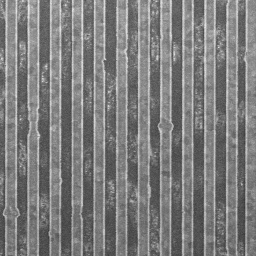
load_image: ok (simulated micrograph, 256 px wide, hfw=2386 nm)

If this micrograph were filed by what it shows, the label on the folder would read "parallel lines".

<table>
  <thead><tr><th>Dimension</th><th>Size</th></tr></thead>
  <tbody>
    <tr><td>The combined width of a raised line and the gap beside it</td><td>0.205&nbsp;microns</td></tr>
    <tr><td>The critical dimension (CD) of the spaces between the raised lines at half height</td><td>0.115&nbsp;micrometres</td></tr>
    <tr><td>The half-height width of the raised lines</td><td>88.5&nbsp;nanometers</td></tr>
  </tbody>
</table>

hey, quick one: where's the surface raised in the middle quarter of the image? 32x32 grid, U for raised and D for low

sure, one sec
DDUUDDDDUUDDDUUUDDDUUDDDUUUDDDUU
DDUUDDDDUUDDDUUUDDDUUDDDUUUDDDUU
DDUUDDDDUUDDDUUUDDDUUDDDUUUDDDUU
DDUUDDDDUUDDDUUUDDDUUDDDUUUDDDUU
DDUUDDDDUUDDDUUUDDDUUDDDUUUDDDUU
DDUUDDDDUUDDDUUUDDDUUDDDUUUDDDUU
DDUUDDDDUUDDDUUUDDDUUDDDUUUDDDUU
DDUUDDDDUUDDDUUUDDDUUDDDUUUDDDUU
DDUUDDDDUUDDDUUUDDDUUDDDUUUDDDUU
DDUUDDDDUUDDDUUUDDDUUDDDUUUDDDUU
DDUUDDDDUUDDDUUUDDDUUDDDUUUDDDUU
DDUUUDDDUUDDDUUUDDDUUDDDUUUDDDUU
DDUUUDDDUUDDDUUUDDDUUDDDUUUDDDUU
DDUUUDDDUUDDDUUUDDDUUDDDUUUDDDUU
DDUUDDDDUUDDDUUUDDDUUDDDUUUDDDUU
DDUUDDDDUUDDDUUUDDDUUDDDUUUDDDUU
DDUUDDDDUUDDDUUUDDDUUDDDUUUDDDUU
DDUUDDDDUUDDDUUUDDDUUDDDUUUDDDUU
DDUUDDDDUUDDDUUUDDDUUDDDUUUDDDUU
DDUUDDDDUUDDDUUUDDDUUDDDUUUDDDUU
DDUUDDDDUUDDDUUUDDDUUDDDUUUDDDUU
DDUUDDDDUUDDDUUUDDDUUDDDUUUDDDUU
DDUUDDDDUUDDDUUUDDDUUDDDUUUDDDUU
DDUUDDDDUUDDDUUUDDDUUDDDUUUDDDUU
DDUUDDDDUUDDDUUUDDDUUDDDUUUDDDUU
DDUUDDDDUUDDDUUUDDDUUDDDUUUDDDUU
DDUUDDDDUUDDDUUUDDDUUDDDUUUDDDUU
DDUUDDDDUUDDDUUUDDDUUDDDUUUDDDUU
DDUUDDDDUUDDDUUUDDDUUDDDUUUDDDUU
DDUUDDDDUUDDDUUUDDDUUDDDUUUDDDUU
DDUUDDDDUUDDDUUUDDDUUDDDUUUDDDUU
DDUUDDDDUUDDDUUUDDDUUDDDUUUDDDUU